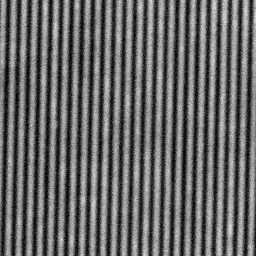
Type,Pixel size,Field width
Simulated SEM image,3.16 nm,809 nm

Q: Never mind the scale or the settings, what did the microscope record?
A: parallel lines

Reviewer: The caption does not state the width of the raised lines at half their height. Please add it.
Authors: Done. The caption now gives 15 nanometers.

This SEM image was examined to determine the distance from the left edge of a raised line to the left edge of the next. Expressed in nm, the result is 33.4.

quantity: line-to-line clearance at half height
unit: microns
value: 0.0182